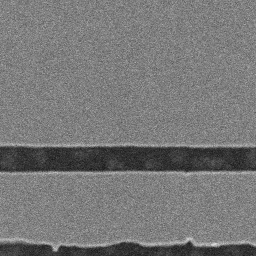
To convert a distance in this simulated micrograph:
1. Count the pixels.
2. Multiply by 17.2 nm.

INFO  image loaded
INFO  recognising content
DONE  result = one or a few lines or trenches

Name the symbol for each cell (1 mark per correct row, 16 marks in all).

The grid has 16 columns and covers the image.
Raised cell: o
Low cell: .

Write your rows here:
oooooooooooooooo
oooooooooooooooo
oooooooooooooooo
oooooooooooooooo
oooooooooooooooo
oooooooooooooooo
oooooooooooooooo
oooooooooooooooo
oooooooooooooooo
................
................
oooooooooooooooo
oooooooooooooooo
oooooooooooooooo
oooooooooooooooo
................